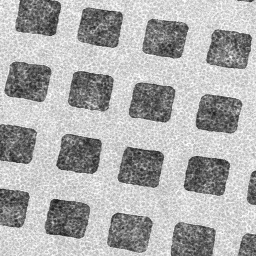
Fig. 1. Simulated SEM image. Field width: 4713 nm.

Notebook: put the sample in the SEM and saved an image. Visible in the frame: a regular array of holes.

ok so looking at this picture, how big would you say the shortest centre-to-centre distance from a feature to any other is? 1170 nm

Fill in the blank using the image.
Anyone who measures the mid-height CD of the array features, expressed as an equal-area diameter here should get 799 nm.